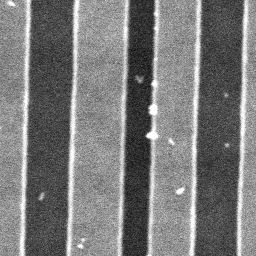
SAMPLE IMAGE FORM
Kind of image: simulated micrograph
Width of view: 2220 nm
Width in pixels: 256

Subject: lines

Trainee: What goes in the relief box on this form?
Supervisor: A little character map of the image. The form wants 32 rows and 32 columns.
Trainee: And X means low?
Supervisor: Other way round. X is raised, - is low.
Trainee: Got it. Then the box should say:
XXXX------XXXXXX----XXXXX------X
XXXX-----XXXXXXX----XXXXX------X
XXXX-----XXXXXXX----XXXXX------X
XXX------XXXXXXX---XXXXXX------X
XXX------XXXXXXX----XXXXX------X
XXX------XXXXXXX----XXXXX------X
XXX------XXXXXXX---XXXXXX------X
XXX------XXXXXXX---XXXXXX------X
XXX------XXXXXXX---XXXXXX------X
XXX------XXXXXXX---XXXXXX------X
XXX------XXXXXX----XXXXXX-----XX
XXX------XXXXXX----XXXXXX-----XX
XXX------XXXXXX----XXXXX------XX
XXX------XXXXXX----XXXXX------XX
XXX------XXXXXX----XXXXX------XX
XXX------XXXXXX----XXXXX------XX
XXX------XXXXXX----XXXXX------XX
XXX------XXXXXX----XXXXX------XX
XXX------XXXXXX----XXXXX------XX
XXX------XXXXXX----XXXXX------XX
XXX------XXXXXX----XXXXX------XX
XXX------XXXXXX----XXXXX------XX
XXX------XXXXXX----XXXXX------XX
XXX------XXXXXX----XXXXX------XX
XXX------XXXXXX----XXXXX------XX
XXX------XXXXXX----XXXXX------XX
XXX------XXXXXX----XXXXX------XX
XXX------XXXXXX----XXXXX------XX
XXX------XXXXXX----XXXXX------XX
XXX------XXXXXX----XXXXX------XX
XXX------XXXXXX----XXXXX------XX
XXX------XXXXXX----XXXXX------XX